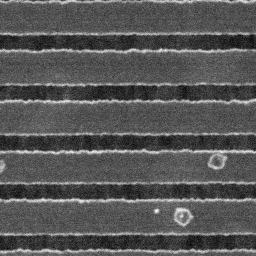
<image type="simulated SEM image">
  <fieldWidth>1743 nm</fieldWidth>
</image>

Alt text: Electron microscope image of lines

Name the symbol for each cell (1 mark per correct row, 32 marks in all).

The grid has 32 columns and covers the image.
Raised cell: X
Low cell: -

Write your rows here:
XXXXXXXXXXXXXXXXXXXXXXXXXXXXXXXX
XXXXXXXXXXXXXXXXXXXXXXXXXXXXXXXX
XXXXXXXXXXXXXXXXXXXXXXXXXXXXXXXX
XXXXXXXXXXXXXXXXXXXXXXXXXXXXXXXX
--------------------------------
--------------------------------
XXXXXXXXXXXXXXXXXXXXXXXXXXXXXXXX
XXXXXXXXXXXXXXXXXXXXXXXXXXXXXXXX
XXXXXXXXXXXXXXXXXXXXXXXXXXXXXXXX
XXXXXXXXXXXXXXXXXXXXXXXXXXXXXXXX
XXXXXXXXXXXXXXXXXXXXXXXXX-XXXXXX
--------------------------------
-------------------------------X
XXXXXXXXXXXXXXXXXXXXXXXXXXXXXXXX
XXXXXXXXXXXXXXXXXXXXXXXXXXXXXXXX
XXXXXXXXXXXXXXXXXXXXXXXXXXXXXXXX
XXXXXXXXXXXXXXXXXXXXXXXXXXXXXXXX
--------------------------------
--------------------------------
XXXXXXXXXXXXXXXXXXXXXXXXXXXXXXXX
XXXXXXXXXXXXXXXXXXXXXXXXXXXXXXXX
XXXXXXXXXXXXXXXXXXXXXXXXXXXXXXXX
XXXXXXXXXXXXXXXXXXXXXXXXXXXXXXXX
--------------------------------
--------------------------------
XXXXXXXXXXXXXXXXXXXXXXXXXXXXXXXX
XXXXXXXXXXXXXXXXXXXXXXXXXXXXXXXX
XXXXXXXXXXXXXXXXXXXXXXXXXXXXXXXX
XXXXXXXXXXXXXXXXXXXXXXXXXXXXXXXX
--------------------------------
--------------------------------
XXXXXXXXXXXXXXXXXXXXXXXXXXXXXXXX